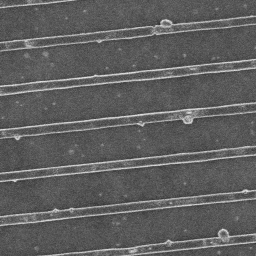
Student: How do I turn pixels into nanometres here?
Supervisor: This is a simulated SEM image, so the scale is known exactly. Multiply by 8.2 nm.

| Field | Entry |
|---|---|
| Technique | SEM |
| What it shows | parallel lines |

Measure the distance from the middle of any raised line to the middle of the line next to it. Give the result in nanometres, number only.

355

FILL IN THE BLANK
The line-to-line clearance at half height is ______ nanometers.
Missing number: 279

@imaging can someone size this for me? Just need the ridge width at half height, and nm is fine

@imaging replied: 70.3